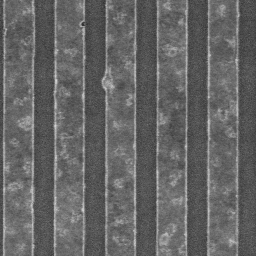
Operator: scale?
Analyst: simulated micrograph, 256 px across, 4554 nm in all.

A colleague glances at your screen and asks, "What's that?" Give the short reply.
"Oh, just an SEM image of parallel lines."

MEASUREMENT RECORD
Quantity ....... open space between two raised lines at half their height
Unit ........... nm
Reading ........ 379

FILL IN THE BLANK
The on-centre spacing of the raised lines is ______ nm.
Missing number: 910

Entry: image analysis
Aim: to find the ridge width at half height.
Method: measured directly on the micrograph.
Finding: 520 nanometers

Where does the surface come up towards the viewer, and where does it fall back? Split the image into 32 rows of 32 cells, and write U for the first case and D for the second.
UUUUDDDUUUDDDUUUUDDDUUUDDDUUUUDD
UUUUDDDUUUDDDUUUUDDDUUUDDDUUUUDD
UUUUDDDUUUDDDUUUUDDDUUUDDDUUUUDD
DUUUDDDUUUDDDUUUUDDDUUUDDDUUUUDD
DUUUDDDUUUDDDUUUUDDDUUUDDDUUUUDD
DUUUDDDUUUDDDUUUUDDDUUUDDDUUUUDD
DUUUDDDUUUDDDUUUUDDDUUUDDDUUUUDD
DUUUDDDUUUUDDUUUUDDDUUUDDDUUUUDD
DUUUDDDUUUDDDUUUUDDDUUUDDDUUUUDD
DUUUDDDUUUDDDUUUUDDDUUUDDDUUUUDD
DUUUDDDUUUDDDUUUUDDDUUUDDDUUUUDD
DUUUDDDUUUDDDUUUUDDDUUUDDDUUUUDD
DUUUDDDUUUDDDUUUUDDDUUUDDDUUUUDD
DUUUDDDUUUDDDUUUUDDDUUUDDDUUUUDD
DUUUDDDUUUDDDUUUUDDDUUUDDDUUUUDD
DUUUDDDUUUUDDUUUUDDDUUUDDDUUUUDD
UUUUDDDUUUUDDUUUUDDDUUUDDDUUUUDD
UUUUDDDUUUUDDUUUUDDDUUUDDDUUUUDD
UUUUDDDUUUUDDUUUUDDDUUUDDDUUUUDD
UUUUDDDUUUUDDUUUUDDDUUUDDDUUUUDD
DUUUDDDUUUUDDUUUUDDDUUUDDDUUUUDD
DUUUDDDUUUDDDUUUUDDDUUUDDDUUUUDD
DUUUDDDUUUDDDUUUUDDDUUUDDDUUUUDD
DUUUDDDUUUUDDUUUUDDDUUUDDDUUUUDD
DUUUDDDUUUDDDUUUUDDDUUUDDDUUUUDD
DUUUDDDUUUDDDUUUUDDDUUUDDDUUUUDD
DUUUDDDUUUDDDUUUUDDDUUUDDDUUUUDD
DUUUDDDUUUDDDUUUUDDDUUUDDDUUUUDD
DUUUDDDUUUDDDUUUUDDDUUUDDDUUUUDD
DUUUDDDUUUDDDUUUUDDDUUUDDDUUUUDD
DUUUDDDUUUDDDUUUUDDDUUUDDDUUUUDD
DUUUDDDUUUDDDUUUUDDDUUUDDDUUUUDD